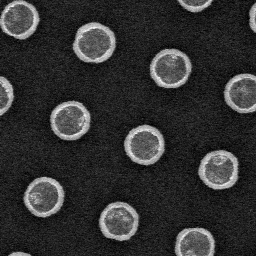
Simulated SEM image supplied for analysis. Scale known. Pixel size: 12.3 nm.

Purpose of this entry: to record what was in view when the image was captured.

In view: a regular array of raised bodies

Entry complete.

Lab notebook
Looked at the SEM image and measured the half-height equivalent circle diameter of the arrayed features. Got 437 nanometres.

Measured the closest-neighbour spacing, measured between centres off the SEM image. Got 968 nm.